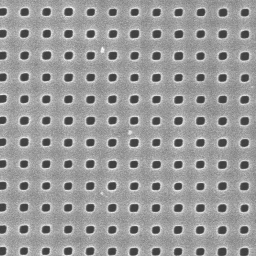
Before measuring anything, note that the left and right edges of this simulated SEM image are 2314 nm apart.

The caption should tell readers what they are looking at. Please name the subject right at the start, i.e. a regular array of holes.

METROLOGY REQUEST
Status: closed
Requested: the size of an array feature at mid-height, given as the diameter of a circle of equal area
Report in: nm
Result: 75.6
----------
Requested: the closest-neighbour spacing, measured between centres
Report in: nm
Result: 196